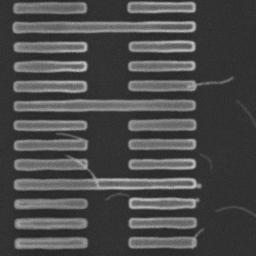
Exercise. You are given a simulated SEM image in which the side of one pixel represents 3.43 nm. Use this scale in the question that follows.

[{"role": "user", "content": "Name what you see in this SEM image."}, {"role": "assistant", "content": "wiring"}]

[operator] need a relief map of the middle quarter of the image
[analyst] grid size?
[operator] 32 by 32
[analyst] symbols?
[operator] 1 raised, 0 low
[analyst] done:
11111100000000001111111111111111
11111000000000001111111111111111
00000000000000000000000000000000
00000000000000000000000000000000
11111000000000000111111111111111
11111100000000001111111111111111
11111000000000000111111111111111
00000000000000000000000000000000
00000000000000000000000000000000
11111111111111111111111111111111
11111111111111111111111111111111
11111110000001111000000000001110
00000000000000000000000000000000
00000000000000000000000000000000
11111000000000001111111111111111
11111100000000001111111111111111
11100000000000001111111111111111
00000000000000000000000000000000
00000000000000000000000000000000
11111100000000001111111111111111
11111100000000001111111111111111
11111000000000000000000000000000
00000000000000000000000000000000
00000000000000000000000000000000
11111100000000001111111111111111
11111100000000001111111111111111
00000000000000000000000000000000
00000000000000000000000000000000
00000001000000000000000000000000
11111111111111111111111111111100
11111111111111111111111111111100
00000000000000000000000000000000